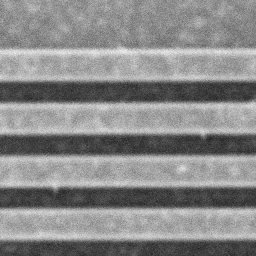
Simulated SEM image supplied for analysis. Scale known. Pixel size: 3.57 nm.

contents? parallel lines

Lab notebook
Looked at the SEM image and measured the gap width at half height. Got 81.2 nanometres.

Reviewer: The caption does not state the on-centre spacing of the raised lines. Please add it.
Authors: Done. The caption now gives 189 nm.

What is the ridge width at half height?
109 nanometres